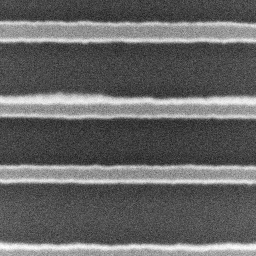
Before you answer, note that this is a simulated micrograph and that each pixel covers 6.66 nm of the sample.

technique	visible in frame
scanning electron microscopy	lines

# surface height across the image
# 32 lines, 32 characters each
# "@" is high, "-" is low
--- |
--------------------------------
--------------------------------
--------------------------------
@@@@@@@@@@@@@@@@@@@@@@@@@@@@@@@@
@@@@@@@@@@@@@@@@@@@@@@@@@@@@@@@@
--------------------------------
--------------------------------
--------------------------------
--------------------------------
--------------------------------
--------------------------------
--------------------------------
--------------------------------
@@@@@@@@@@@@@@@@@@@@@@@@@@@@@@@@
@@@@@@@@@@@@@@@@@@@@@@@@@@@@@@@@
--------------------------------
--------------------------------
--------------------------------
--------------------------------
--------------------------------
--------------------------------
@@@@@@@@@@@@@@@@@@@@@@@@@@@@@@@@
@@@@@@@@@@@@@@@@@@@@@@@@@@@@@@@@
--------------------------------
--------------------------------
--------------------------------
--------------------------------
--------------------------------
--------------------------------
--------------------------------
--------------------------------
@@@@@@@@@@@@@@@@@@@@@@@@@@@@@@@@